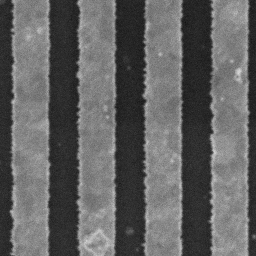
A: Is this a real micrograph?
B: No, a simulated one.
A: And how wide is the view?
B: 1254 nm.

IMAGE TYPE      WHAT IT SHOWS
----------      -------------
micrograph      lines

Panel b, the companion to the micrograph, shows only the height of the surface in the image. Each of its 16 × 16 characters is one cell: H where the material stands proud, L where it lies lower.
LHHLLHHLLHHLLHHL
LHHLLHHLLHHLLHHL
LHHLLHHLLHHLLHHL
LHHLLHHLLHHLLHHL
LHHLLHHLLHHLLHHL
LHHLLHHLLHHLLHHL
LHHLLHHLLHHLLHHL
LHHLLHHLLHHLLHHL
LHHLLHHLLHHLLHHL
LHHLLHHLLHHLLHHL
LHHLLHHLLHHLLHHL
LHHLLHHLLHHLLHHL
LHHLLHHLLHHLLHHL
LHHLLHHLLHHLLHHL
LHHLLHHLLHHLLHHL
LHHLLHHLLHHLLHHL